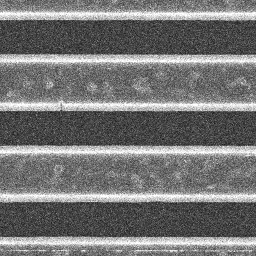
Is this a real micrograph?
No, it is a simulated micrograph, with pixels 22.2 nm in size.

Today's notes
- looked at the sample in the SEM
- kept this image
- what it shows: one or a few lines or trenches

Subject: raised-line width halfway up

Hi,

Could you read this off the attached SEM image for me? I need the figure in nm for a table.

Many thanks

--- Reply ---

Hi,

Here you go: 1090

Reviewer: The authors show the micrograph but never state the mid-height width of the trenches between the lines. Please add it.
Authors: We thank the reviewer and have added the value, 934 nanometres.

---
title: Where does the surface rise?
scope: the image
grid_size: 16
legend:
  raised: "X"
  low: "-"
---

XXXXXXXXXXXXXXXX
----------------
----------------
----------------
XXXXXXXXXXXXXXXX
XXXXXXXXXXXXXXXX
XXXXXXXXXXXXXXXX
----------------
----------------
XXXXXXXXXXXXXXXX
XXXXXXXXXXXXXXXX
XXXXXXXXXXXXXXXX
----------------
----------------
----------------
XXXXXXXXXXXXXXXX